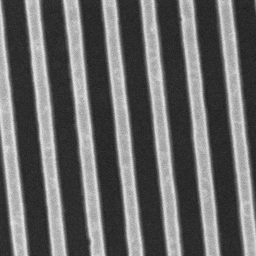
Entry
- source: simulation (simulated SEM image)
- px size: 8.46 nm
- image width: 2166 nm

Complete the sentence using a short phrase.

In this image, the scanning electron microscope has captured parallel lines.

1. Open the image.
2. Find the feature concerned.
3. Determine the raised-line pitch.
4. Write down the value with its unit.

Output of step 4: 0.324 um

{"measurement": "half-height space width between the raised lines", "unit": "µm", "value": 0.201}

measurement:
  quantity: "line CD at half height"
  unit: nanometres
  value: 126